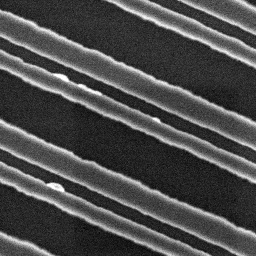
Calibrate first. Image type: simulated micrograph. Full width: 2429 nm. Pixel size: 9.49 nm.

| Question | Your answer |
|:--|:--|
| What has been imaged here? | lines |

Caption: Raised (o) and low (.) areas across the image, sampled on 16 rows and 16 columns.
........oooooooo
oo........oooooo
oooo........oooo
ooooooo........o
.oooooooo.......
...oooooooo.....
.....oooooooo...
.......oooooooo.
oo........oooooo
oooo........oooo
oooooo........oo
.oooooooo.......
...oooooooo.....
.....oooooooo...
.......ooooooooo
oo........oooooo